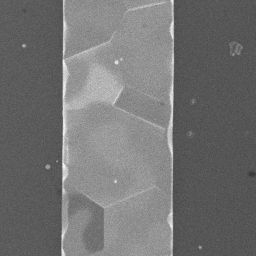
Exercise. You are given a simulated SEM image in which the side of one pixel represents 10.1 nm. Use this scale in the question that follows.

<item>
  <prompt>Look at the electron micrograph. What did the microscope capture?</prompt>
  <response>wiring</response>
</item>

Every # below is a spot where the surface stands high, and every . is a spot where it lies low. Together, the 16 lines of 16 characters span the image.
....#######.....
....#######.....
....#######.....
....#######.....
....#######.....
....#######.....
....#######.....
....#######.....
....#######.....
....#######.....
....#######.....
....#######.....
....#######.....
....#######.....
....#######.....
....#######.....